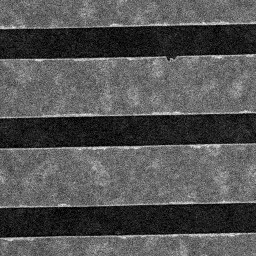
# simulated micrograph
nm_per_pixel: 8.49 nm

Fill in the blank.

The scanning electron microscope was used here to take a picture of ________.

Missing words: one or a few lines or trenches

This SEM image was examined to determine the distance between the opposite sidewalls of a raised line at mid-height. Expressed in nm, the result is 488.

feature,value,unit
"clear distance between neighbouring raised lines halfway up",31.6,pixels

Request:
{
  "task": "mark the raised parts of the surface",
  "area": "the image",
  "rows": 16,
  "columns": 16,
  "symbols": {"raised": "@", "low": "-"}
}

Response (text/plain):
@@@@@@@@@@@@@@@@
@@@@@@@@@@@@@@@-
----------------
------------@@@@
@@@@@@@@@@@@@@@@
@@@@@@@@@@@@@@@@
@@@@@@@@@@@@@@@@
----------------
----------------
@@@@@@@@@@@@@@@@
@@@@@@@@@@@@@@@@
@@@@@@@@@@@@@@@@
@@@@@@@@@@@@@@@@
----------------
----------------
@@@@@@@@@@@@@@@@